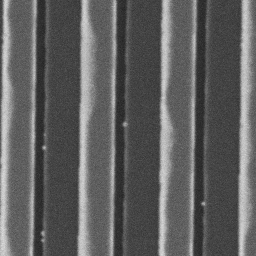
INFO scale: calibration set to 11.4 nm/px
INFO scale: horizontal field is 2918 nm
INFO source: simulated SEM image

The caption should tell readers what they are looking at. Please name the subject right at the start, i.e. lines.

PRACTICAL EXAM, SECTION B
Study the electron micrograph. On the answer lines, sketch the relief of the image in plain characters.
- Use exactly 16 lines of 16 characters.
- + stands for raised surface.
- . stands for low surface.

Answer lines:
++...++...++...+
++...++...++...+
++...++...++...+
++...++...++...+
++...++...++...+
++...++...++...+
++...++...++...+
++...++...++...+
++...++...++...+
++...++...++...+
++...++...++...+
++...++...++...+
++...++...++...+
++...++...++...+
++...++...++...+
++...++...++...+